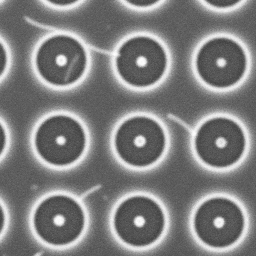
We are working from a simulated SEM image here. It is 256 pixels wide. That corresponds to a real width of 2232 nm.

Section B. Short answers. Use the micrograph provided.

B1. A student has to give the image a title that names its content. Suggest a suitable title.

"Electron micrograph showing an array of small figures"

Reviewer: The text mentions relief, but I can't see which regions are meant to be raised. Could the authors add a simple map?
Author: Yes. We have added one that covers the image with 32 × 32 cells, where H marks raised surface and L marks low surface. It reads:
HHHHHHLLLHHHHHHHLLLLHHHHHHLLLLHH
HHHHHHHHHHHHHHHHHHHHHHHHHHHHHHHH
HHHHHHHHHHHHHHHHHHHHHHHHHHHHHHHH
HHHHHHHHHHHHHHHHHHHHHHHHHHHHHHHH
HHHHHHLLLHHHHHHHHLLHHHHHHHHLHHHH
HHHHHLLLLLHHHHHLLLLLHHHHHLLLLLHH
LHHHLLLLLLLHHHHLLLLLLHHHHLLLLLLH
LHHHLLLHLLLHHHLLLLLLLHHHLLLLLLLH
LHHHLLLLLLLHHHLLLLLLLHHHLLLLLLLH
HHHHHLLLLLHHHHHLLLLLHHHHHLLLLLLH
HHHHHHLLLHHHHHHHLLLHHHHHHHLLLLHH
HHHHHHHHHHHHHHHHHHHHHHHHHHHHHHHH
HHHHHHHHHHHHHHHHHHHHHHHHHHHHHHHH
HHHHHHHHHHHHHHHHHHHHHHHHHHHHHHHH
HHHHHHLLLHHHHHHHHLHHHHHHHHHLHHHH
HHHHHLLLLLHHHHHLLLLLHHHHHLLLLLHH
LHHHLLLLLLLHHHLLLLLLLHHHLLLLLLLH
LHHHLLLLLLLHHHLLLHLLLHHHLLLLLLLH
LHHHLLLLLLLHHHLLLLLLLHHHLLLLLLLH
HHHHHLLLLLHHHHHLLLLLHHHHHLLLLLHH
HHHHHHLLLHHHHHHHLLLHHHHHHHLLLLHH
HHHHHHHHHHHHHHHHHHHHHHHHHHHHHHHH
HHHHHHHHHHHHHHHHHHHHHHHHHHHHHHHH
HHHHHHHHHHHHHHHHHHHHHHHHHHHHHHHH
HHHHHHLLLHHHHHHHLLHHHHHHHHHHHHHH
HHHHHLLLLLHHHHHLLLLLHHHHHLLLLLHH
LHHHLLLLLLLHHHLLLLLLHHHHLLLLLLHH
LHHHLLLLLLLHHHLLLLLLLHHHLLLLLLLH
LHHHLLLLLLLHHHLLLLLLLHHHLLLLLLLH
HHHHHLLLLLHHHHHLLLLLHHHHHLLLLLHH
HHHHHHLLLHHHHHHHLLLHHHHHHHLLLHHH
HHHHHHHHHHHHHHHHHHHHHHHHHHHHHHHH